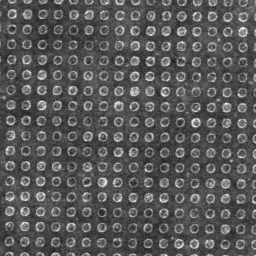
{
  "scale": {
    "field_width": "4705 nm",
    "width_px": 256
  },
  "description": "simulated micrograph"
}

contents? a regular array of raised bodies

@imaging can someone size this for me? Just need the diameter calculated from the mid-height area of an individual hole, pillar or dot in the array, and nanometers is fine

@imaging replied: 158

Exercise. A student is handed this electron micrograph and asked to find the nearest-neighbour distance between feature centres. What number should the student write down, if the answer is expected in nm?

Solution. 274